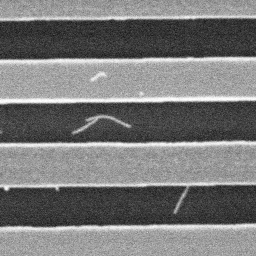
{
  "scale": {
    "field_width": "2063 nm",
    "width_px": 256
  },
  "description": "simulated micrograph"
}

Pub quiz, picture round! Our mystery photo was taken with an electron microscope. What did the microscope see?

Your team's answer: lines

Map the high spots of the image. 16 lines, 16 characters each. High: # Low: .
################
................
................
................
################
################
................
................
................
################
################
################
................
................
################
################